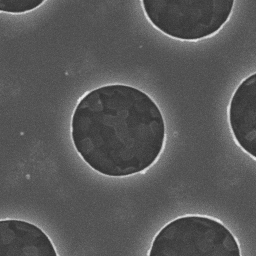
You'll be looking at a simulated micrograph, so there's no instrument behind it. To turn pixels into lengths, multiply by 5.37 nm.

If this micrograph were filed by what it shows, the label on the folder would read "holes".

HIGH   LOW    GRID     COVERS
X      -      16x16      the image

--XXXXXXX------X
XXXXXXXXXX----XX
XXXXXXXXXXXXXXXX
XXXXXXXXXXXXXXXX
XXXXXXXXXXXXXXXX
XXXXXX--XXXXXXX-
XXXXX-----XXXX--
XXXXX-----XXXX--
XXXXX-----XXXXX-
XXXXX-----XXXXX-
XXXXXX---XXXXXXX
XXXXXXXXXXXXXXXX
XXXXXXXXXXXXXXXX
XXXXXXXXXXXXXXXX
---XXXXXXX----XX
---XXXXXX------X